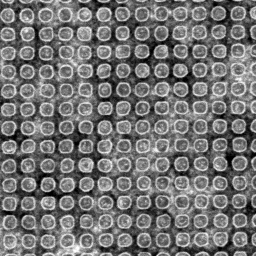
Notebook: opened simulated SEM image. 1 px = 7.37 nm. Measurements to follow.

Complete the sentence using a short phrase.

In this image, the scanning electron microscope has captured a regular array of raised bodies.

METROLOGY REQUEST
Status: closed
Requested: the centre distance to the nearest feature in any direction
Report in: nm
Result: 136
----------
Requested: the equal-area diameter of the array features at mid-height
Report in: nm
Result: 102